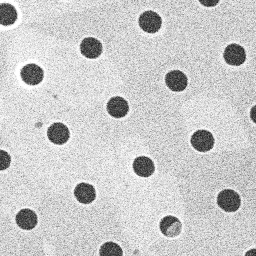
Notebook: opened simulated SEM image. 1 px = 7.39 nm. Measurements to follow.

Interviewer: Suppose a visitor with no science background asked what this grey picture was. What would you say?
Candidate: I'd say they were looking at a regular array of holes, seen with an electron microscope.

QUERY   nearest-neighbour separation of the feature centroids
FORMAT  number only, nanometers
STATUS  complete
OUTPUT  475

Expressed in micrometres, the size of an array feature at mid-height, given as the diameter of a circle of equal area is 0.173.